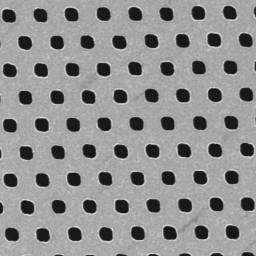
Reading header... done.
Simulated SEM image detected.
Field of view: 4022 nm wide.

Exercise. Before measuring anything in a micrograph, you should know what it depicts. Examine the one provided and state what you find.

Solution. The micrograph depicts a regular array of holes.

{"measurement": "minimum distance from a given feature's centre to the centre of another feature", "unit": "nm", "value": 489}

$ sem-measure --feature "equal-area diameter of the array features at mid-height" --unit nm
226